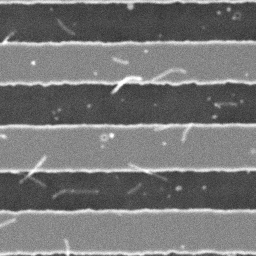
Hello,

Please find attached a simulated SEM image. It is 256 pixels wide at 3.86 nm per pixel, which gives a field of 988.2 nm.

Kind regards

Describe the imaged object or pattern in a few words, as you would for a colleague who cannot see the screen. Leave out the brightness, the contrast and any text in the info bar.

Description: lines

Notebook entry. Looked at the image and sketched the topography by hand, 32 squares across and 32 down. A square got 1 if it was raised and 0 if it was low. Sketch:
00000000000000000000000000000000
00000000000000000000000000000000
00000000000000000000000000000000
00000000000000000000000000000000
00000000000000000000000000000000
11111111111111111111111111111111
11111111111111111111111111111111
11111111111111111111111111111111
11111111111111111111111111111111
11111111111111111111111111111111
11111111010001110101111001100001
00000000000000000000000000000000
00000000000000000000000000000000
00000000000000000000000000000000
00000000000000000000000000000000
00000000000000000000000000000100
11111111111111111111111111111111
11111111111111111111111111111111
11111111111111111111111111111111
11111111111111111111111111111111
11111111111111111111111111111111
01000000000000000000000000000000
00000000000000000000000000000000
00000000000000000000000000000000
00000000000000000000000000000000
00000000000000000000000000000000
10111111111111111111111111111111
11111111111111111111111111111111
11111111111111111111111111111111
11111111111111111111111111111111
11111111111111111111111111111111
11111111111111111111111111111111